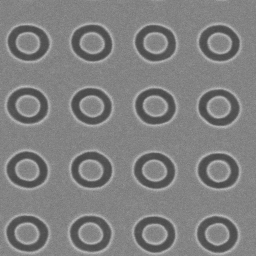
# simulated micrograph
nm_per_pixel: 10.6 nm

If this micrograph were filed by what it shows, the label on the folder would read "a regular array of ring-shaped grooves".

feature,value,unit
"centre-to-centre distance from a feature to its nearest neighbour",668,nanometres